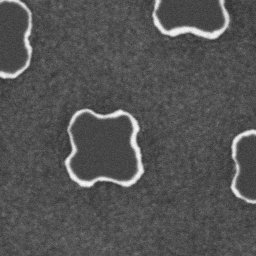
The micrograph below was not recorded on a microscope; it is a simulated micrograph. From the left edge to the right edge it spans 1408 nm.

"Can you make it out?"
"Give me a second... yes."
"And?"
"raised bodies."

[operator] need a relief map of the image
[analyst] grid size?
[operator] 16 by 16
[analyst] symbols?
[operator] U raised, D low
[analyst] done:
UUDDDDDDDDUUUUDD
UUDDDDDDDDUUUUDD
UUDDDDDDDDDDDDDD
UUDDDDDDDDDDDDDD
UDDDDDDDDDDDDDDD
DDDDDDDDDDDDDDDD
DDDDDDDDDDDDDDDD
DDDDDUUUDDDDDDDD
DDDDUUUUDDDDDDDU
DDDDUUUUUDDDDDDU
DDDDUUUUUDDDDDDU
DDDDDDDDDDDDDDDU
DDDDDDDDDDDDDDDU
DDDDDDDDDDDDDDDD
DDDDDDDDDDDDDDDD
DDDDDDDDDDDDDDDD